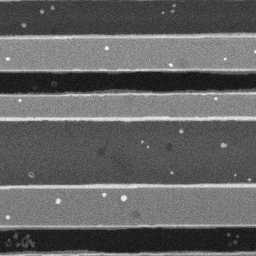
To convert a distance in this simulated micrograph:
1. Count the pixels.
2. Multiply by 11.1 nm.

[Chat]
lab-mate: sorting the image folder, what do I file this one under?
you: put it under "lines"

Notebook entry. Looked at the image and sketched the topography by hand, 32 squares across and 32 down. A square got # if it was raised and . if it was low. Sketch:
................................
................................
................................
................................
................................
################################
################################
################################
################################
................................
................................
................................
################################
################################
################################
................................
................................
................................
................................
................................
................................
................................
................................
################################
################################
################################
################################
################################
................................
................................
................................
................................